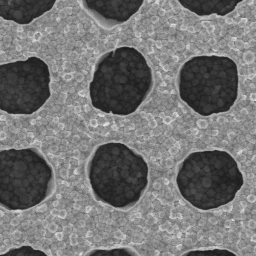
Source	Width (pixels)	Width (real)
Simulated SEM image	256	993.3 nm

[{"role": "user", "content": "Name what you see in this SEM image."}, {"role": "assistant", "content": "holes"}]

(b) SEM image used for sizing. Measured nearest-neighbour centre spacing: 350 nm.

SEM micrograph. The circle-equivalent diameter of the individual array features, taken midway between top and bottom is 241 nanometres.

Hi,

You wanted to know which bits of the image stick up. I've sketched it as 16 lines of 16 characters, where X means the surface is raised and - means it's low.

---XX----XXX---X
XXXXXXXXXXXXXXXX
XXXXXXXXXXXXXXXX
XXXXXX---XXX--XX
---XXX---XX----X
---XXX---XX----X
---XXX---XXX---X
XXXXXXXXXXXXXXXX
XXXXXXXXXXXXXXXX
--XXXX--XXXX--XX
---XXX---XX----X
---XXX---XX----X
---XXX---XXX--XX
XXXXXXXXXXXXXXXX
XXXXXXXXXXXXXXXX
X-XXXXXXXXXXXXXX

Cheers